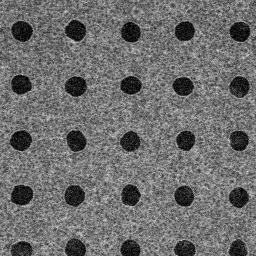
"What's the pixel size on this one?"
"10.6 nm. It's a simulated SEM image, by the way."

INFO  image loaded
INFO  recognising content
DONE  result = a regular array of holes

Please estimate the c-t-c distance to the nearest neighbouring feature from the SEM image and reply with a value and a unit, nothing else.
571 nm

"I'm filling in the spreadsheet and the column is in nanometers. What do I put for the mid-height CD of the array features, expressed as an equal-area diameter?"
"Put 227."